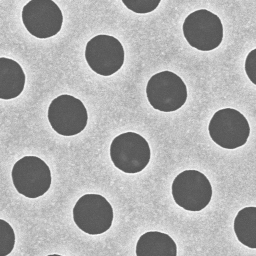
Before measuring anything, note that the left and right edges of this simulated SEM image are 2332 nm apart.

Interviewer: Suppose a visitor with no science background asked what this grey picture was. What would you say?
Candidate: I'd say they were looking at a regular array of holes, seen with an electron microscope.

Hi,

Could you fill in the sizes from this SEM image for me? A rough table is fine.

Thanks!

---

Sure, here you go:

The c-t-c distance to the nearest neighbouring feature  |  0.649 µm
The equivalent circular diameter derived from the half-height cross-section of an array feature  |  0.375 um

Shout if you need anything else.